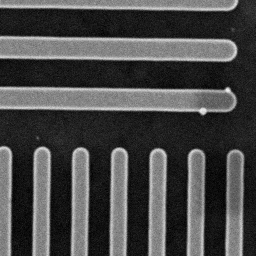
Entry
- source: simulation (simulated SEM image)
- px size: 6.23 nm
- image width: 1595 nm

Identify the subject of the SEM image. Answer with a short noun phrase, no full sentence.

groups of lines, slits or small figures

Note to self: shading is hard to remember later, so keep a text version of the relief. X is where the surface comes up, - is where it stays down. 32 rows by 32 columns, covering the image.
XXXXXXXXXXXXXXXXXXXXXXXXXXXXXX--
--------------------------------
--------------------------------
--------------------------------
--------------------------------
XXXXXXXXXXXXXXXXXXXXXXXXXXXXX---
XXXXXXXXXXXXXXXXXXXXXXXXXXXXXX--
-----------------------XXXXXX---
--------------------------------
--------------------------------
--------------------------------
XXXXXXXXXXXXXXXXXXXXXXXXXXXXX---
XXXXXXXXXXXXXXXXXXXXXXXXXXXXXX--
XXXXXXXXXXXXXXXXXXXXXXXXXXXXX---
--------------------------------
--------------------------------
--------------------------------
--------------------------------
X----X--------------------------
X---XX---XX---XX---XX---XX--XX--
X---XX---XX---XX---XX---XX--XX--
X---XX---XX---XX---XX---X---XX--
X---XX---XX---XX---XX---X---XX--
X---XX---XX---XX---XX---X---XX--
X---XX---XX---XX---XX---X---XX--
X---XX---XX---XX---XX---X---XX--
X---XX---XX---XX---XX---X---XX--
X---XX---XX---XX---XX---X---XX--
X---XX---XX---XX---XX---X---XX--
X---XX---XX---XX---XX---X---XX--
X---XX---XX---XX---XX--XX---XX--
X---XX---XX---XX---XX--XX---XX--